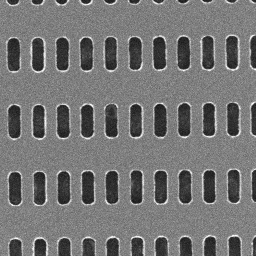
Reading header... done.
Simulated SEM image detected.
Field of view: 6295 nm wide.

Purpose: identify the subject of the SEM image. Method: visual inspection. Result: a regular array of holes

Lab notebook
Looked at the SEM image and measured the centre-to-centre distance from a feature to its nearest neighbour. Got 597 nm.